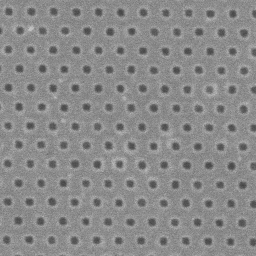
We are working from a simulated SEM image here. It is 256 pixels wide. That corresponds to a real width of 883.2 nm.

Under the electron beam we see a regular array of holes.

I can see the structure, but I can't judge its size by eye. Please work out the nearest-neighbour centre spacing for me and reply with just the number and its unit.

74.9 nanometres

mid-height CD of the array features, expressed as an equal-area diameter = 32.3 nm